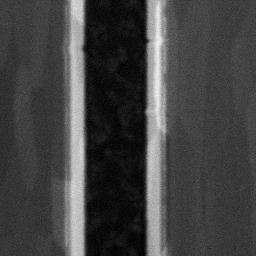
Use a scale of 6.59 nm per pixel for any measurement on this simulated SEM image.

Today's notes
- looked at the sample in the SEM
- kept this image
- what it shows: one or a few lines or trenches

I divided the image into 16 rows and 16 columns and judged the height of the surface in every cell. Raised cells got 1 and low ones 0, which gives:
1111100000111111
1111100000111111
1111100000111111
1111100000111111
1111100000111111
1111100000111111
1111100000111111
1111100000111111
1111100000111111
1111100000111111
1111100000111111
1111100000111111
1111100000111111
1111100000111111
1111100000111111
1111100000111111